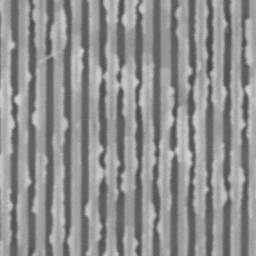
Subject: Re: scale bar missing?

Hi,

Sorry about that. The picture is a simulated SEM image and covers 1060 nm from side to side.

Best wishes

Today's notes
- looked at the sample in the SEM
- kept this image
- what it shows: parallel lines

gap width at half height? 7.63 px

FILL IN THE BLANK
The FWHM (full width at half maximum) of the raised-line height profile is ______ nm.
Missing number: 42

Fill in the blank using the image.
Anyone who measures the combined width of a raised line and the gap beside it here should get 0.0734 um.